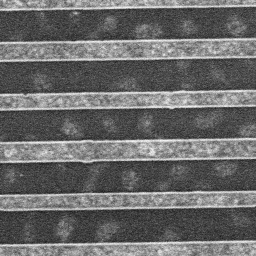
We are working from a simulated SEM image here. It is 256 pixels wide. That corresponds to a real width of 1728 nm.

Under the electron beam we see parallel lines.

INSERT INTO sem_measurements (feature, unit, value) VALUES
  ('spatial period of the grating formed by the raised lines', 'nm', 340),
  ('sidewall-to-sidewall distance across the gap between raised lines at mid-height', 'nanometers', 227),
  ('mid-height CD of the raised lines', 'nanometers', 114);